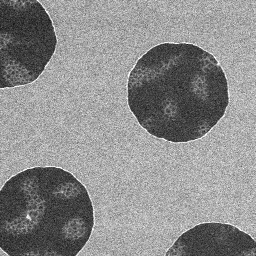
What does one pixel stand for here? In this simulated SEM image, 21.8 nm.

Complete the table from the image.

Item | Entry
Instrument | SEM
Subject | raised bodies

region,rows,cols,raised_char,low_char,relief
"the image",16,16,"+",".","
+++.............
+++.............
++++............
+++......++++...
+++.....++++++..
........++++++..
........++++++..
.........+++++..
..........+++...
................
..++............
+++++...........
++++++..........
++++++..........
++++++......+++.
+++++......+++++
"